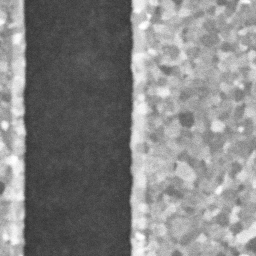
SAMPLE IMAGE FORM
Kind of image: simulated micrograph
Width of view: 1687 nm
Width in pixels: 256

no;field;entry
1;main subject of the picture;one or a few lines or trenches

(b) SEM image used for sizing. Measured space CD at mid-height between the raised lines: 122 pixels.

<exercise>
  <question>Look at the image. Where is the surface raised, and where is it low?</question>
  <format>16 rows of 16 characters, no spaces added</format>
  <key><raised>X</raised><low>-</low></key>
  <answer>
X--------XXXXXXX
X--------XXXXXXX
X--------XXXXXXX
X--------XXXXXXX
X--------XXXXXXX
X--------XXXXXXX
X--------XXXXXXX
X--------XXXXXXX
X--------XXXXXXX
X--------XXXXXXX
X--------XXXXXXX
X--------XXXXXXX
X--------XXXXXXX
X--------XXXXXXX
X--------XXXXXXX
X--------XXXXXXX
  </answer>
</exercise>